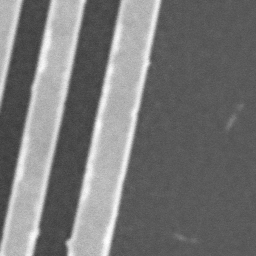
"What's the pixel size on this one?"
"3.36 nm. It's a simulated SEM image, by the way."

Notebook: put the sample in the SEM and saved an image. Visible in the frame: one or a few lines or trenches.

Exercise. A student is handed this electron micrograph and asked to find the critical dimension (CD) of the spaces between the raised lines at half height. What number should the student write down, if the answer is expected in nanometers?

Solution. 127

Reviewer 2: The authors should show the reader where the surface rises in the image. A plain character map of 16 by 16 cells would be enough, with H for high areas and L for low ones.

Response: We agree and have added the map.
HLLHHLLLHHLLLLLL
HLLHHLLHHHLLLLLL
HLLHHLLHHLLLLLLL
HLLHHLLHHLLLLLLL
LLHHLLLHHLLLLLLL
LLHHLLHHHLLLLLLL
LLHHLLHHHLLLLLLL
LLHHLLHHLLLLLLLL
LLHLLLHHLLLLLLLL
LHHLLLHHLLLLLLLL
LHHLLHHHLLLLLLLL
LHHLLHHHLLLLLLLL
LHHLLHHLLLLLLLLL
HHLLLHHLLLLLLLLL
HHLLLHHLLLLLLLLL
HHLLHHHLLLLLLLLL